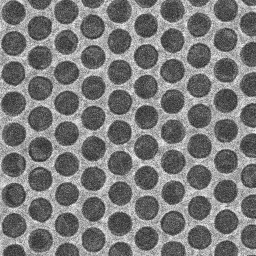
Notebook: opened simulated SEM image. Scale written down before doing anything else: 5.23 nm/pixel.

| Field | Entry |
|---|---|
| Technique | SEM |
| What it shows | a regular array of holes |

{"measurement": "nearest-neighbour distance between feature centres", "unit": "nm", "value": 158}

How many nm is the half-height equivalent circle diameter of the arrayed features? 131